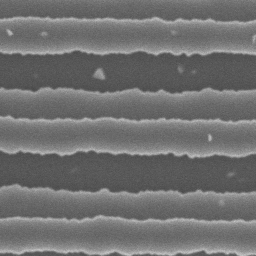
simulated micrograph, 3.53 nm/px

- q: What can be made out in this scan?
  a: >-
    lines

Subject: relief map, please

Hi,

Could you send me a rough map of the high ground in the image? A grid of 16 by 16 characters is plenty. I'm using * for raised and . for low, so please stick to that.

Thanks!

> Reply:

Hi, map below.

****************
****************
****************
................
................
................
****************
****************
****************
*****.**********
................
................
****************
****************
****************
****************